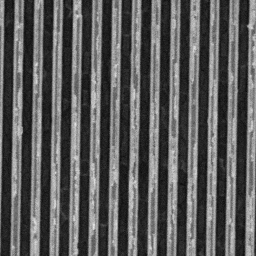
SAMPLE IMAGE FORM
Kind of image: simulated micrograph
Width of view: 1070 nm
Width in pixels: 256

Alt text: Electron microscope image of parallel lines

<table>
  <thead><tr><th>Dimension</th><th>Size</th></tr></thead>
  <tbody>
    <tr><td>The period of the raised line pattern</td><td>81.6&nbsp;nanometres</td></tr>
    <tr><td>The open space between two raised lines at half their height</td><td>51.2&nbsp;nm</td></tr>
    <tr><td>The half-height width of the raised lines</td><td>0.0293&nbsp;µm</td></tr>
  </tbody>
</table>